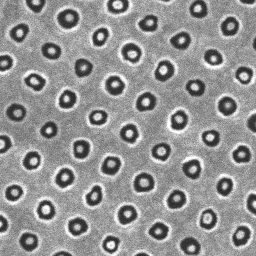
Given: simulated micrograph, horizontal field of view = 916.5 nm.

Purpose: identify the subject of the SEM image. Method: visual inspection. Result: a regular array of ring-shaped grooves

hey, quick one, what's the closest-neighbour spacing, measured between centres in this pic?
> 0.125 um